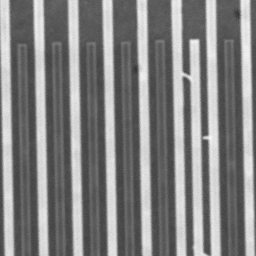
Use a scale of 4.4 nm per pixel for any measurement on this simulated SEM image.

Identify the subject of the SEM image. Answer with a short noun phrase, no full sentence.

parallel lines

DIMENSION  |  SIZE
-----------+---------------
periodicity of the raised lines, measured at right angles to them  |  75.8 nm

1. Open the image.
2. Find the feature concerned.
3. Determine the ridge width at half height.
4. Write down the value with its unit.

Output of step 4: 37.4 nanometres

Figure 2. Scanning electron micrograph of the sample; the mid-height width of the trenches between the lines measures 41.3 nanometres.